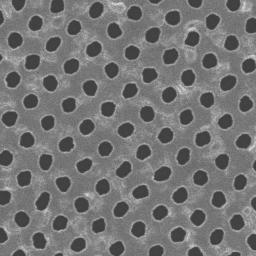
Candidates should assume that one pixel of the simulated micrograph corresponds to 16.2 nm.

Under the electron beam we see a regular array of holes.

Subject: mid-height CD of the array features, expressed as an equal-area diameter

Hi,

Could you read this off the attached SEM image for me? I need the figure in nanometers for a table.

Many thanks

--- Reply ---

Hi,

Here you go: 246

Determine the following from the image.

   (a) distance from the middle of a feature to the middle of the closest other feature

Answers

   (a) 434 nanometers